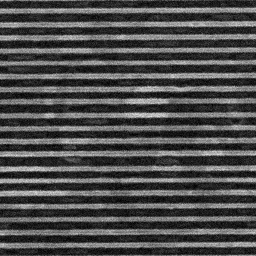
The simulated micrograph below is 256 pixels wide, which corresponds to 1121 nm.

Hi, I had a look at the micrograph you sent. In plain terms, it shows parallel lines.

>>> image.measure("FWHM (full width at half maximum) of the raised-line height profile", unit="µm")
0.0186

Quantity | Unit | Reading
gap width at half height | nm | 38.3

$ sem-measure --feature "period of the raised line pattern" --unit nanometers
57